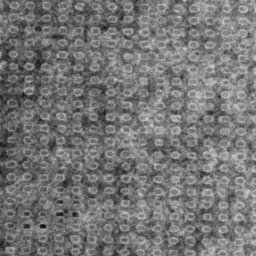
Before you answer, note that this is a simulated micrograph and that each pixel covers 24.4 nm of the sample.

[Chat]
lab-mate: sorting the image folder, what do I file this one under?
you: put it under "a regular array of raised bodies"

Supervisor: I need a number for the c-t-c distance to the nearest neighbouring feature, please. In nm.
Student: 293